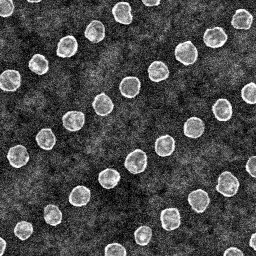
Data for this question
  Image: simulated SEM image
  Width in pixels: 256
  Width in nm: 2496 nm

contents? a regular array of raised bodies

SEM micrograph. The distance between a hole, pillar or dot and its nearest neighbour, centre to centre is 316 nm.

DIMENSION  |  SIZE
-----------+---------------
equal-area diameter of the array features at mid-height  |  195 nm